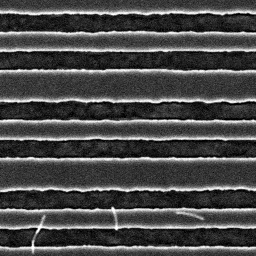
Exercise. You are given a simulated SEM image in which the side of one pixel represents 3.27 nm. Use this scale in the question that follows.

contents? lines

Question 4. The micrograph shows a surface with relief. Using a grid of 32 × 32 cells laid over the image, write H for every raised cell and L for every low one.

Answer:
HHHHHHHHHHHHHHHHHHHHHHHHHHHHHHHH
HHHHHHHHHHHHHHHHHHHHHHHHHHHHHHHH
LLLLLLLLLLLLLLLLLLLLLLLLLLLLLLLL
LLLLLLLLLLLLLLLLLLLLLLLLLLLLLLLL
HHHHHHHHHHHHHHHHHHHHHHHHHHHHHHHH
HHHHHHHHHHHHHHHHHHHHHHHHHHHHHHHH
LLLLLLLLLLLLLLLLLLLLLLLLLLLLLLLL
LLLLLLLLLLLLLLLLLLLLLLLLLLLLLLLL
LLLLLLLLLLLLLLLLLLLLLLLLLLLLLLLL
HHHHHHHHHHHHHHHHHHHHHHHHHHHHHHHH
HHHHHHHHHHHHHHHHHHHHHHHHHHHHHHHH
HHHHHHHHHHHHHHHHHHHHHHHHHHHHHHHH
HHHHHHHHHHHHHHHHHHHHHHHHHHHHHHHH
LLLLLLLLLLLLLLLLLLLLLLLLLLLLLLLL
LLLLLLLLLLLLLLLLLLLLLLLLLLLLLLLL
HHHHHHHHHHHHHHHHHHHHHHHHHHHHHHHH
HHHHHHHHHHHHHHHHHHHHHHHHHHHHHHHH
LLHLHHHHHLLLLLLLLLHHHLLLLLLLHLLL
LLLLLLLLLLLLLLLLLLLLLLLLLLLLLLLL
LLLLLLLLLLLLLLLLLLLLLLLLLLLLLLLL
HHHHHHHHHHHHHHHHHHHHHHHHHHHHHHHH
HHHHHHHHHHHHHHHHHHHHHHHHHHHHHHHH
HHHHHHHHHHHHHHHHHHHHHHHHHHHHHHHH
HHHHHHHHHHHHHHHHHHHHHHHHHHHHHHHH
LLLLLLLLLLLLLLLLLLLLLLLLLLLLLLLL
LLLLLLLLLLLLLLLLLLLLLLLLLLLLLLLL
HHHHHHHHHHHHHHHHHHHHHHHHHHHHHHHH
HHHHHHHHHHHHHHHHHHHHHHHHHHHHHHHH
HHHHHHHHHHHHHHHHLHHHHHHHHHHHHLHH
LLLLLLLLLLLLLLLLLLLLLLLLLLLLLLLL
LLLLLLLLLLLLLLLLLLLLLLLLLLLLLLLL
HHHHHHHHHHHHHHHHHHHHHHHHHHHHHHHH